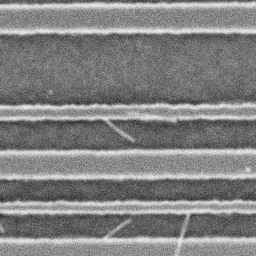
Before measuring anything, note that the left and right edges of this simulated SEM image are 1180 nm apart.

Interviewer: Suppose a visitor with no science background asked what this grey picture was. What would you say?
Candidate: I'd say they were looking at lines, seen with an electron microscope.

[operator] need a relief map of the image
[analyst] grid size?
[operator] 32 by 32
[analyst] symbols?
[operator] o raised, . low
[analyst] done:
.................o..o...oooooooo
oooooooooooooooooooooooooooooooo
oooooooooooooooooooooooooooooooo
oooooooooooooooooooooooooooooooo
................................
................................
................................
................................
................................
................................
................................
................................
................................
oooooooooooooooooooooooooooooooo
oooooooooooooooooooooooooooooooo
................................
................................
................................
................................
oooooooooooooooooooooooooooooooo
oooooooooooooooooooooooooooooooo
oooooooooooooooooooooooooooooooo
................................
................................
................................
oooooooooooooooooooooooooooooooo
ooooooooooooooooooooooooo.ooo.oo
................................
................................
................................
oooooooooooooooooooooooooooooooo
oooooooooooooooooooooooooooooooo